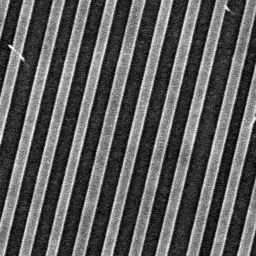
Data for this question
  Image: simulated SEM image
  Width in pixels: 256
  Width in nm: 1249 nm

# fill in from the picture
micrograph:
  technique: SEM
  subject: parallel lines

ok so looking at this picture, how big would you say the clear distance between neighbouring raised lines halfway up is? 77.2 nm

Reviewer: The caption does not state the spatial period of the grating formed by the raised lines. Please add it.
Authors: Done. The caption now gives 26.8 px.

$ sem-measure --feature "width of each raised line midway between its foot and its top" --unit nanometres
52.8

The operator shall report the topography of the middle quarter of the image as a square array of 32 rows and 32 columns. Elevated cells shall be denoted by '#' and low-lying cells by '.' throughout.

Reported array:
###....##....###.....##....###..
###...###....###....###....###..
##....###....###....###....###..
##....##.....###....##.....###..
##....##....###.....##.....##...
##...###....###....###....###...
#....###....###....###....###...
#....##.....###....##.....###...
#....##....###.....##.....##....
#....##....###.....##....###....
....###....###....###....###....
....###....###....##.....###...#
....##....###.....##.....##....#
....##....###.....##....###....#
...###....###....###....###....#
...###....###....###....###....#
...##....###.....##.....##....##
...##....###.....##....###....##
...##....###....###....###....##
..###....###....###....###....##
..##.....###....##.....##....###
..##....###.....##.....##....###
.###....###....###....###....###
.###....###....###....###....##.
.##.....###....##.....###...###.
.##....###.....##.....##....###.
.##....###....###....###....###.
###....###....###....###....##..
##.....###....##.....###...###..
##....###.....##.....##....###..
##....###.....##....###....###..
##....###....###....###....##...